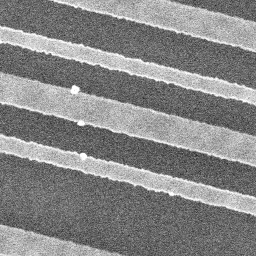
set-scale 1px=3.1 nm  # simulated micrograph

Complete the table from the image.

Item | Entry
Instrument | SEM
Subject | lines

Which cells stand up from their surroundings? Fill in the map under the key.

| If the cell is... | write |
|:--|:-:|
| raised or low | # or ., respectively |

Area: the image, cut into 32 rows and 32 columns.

........###############.........
............###############.....
................###############.
#...................############
#####...................########
.########...................####
.....########...................
.........########...............
.............########...........
##...............########.......
######................#######...
##########................######
##############................##
...###############..............
.......###############..........
..........################......
..............###############...
###................#############
#######................#########
..#########................#####
.......########................#
..........#########.............
..............#########.........
..................#########.....
.......................########.
..........................######
..............................##
................................
##..............................
######..........................
#########.......................
#############...................